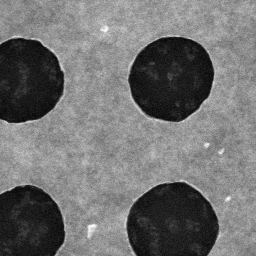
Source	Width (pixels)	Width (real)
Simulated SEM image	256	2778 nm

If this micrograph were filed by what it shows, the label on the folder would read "holes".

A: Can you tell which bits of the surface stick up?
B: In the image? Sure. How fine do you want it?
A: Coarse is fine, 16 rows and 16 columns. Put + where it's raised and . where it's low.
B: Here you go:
++++++++++++++++
++++++++++++++++
+.++++++++..++++
...++++++....+++
....++++.....+++
....++++.....+++
....+++++....+++
..++++++++.+++++
++++++++++++++++
++++++++++++++++
++++++++++++++++
++++++++++..++++
...++++++....+++
....++++......++
....++++......++
....++++.....+++